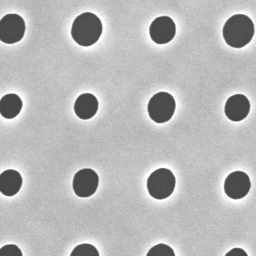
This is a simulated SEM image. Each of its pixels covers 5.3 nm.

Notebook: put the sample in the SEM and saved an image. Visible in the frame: a regular array of holes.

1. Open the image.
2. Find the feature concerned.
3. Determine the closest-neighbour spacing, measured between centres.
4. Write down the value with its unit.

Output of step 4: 401 nm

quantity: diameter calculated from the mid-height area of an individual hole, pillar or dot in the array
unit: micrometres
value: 0.149